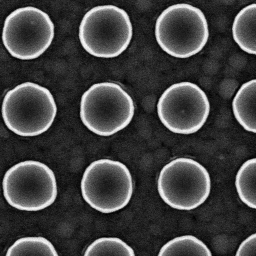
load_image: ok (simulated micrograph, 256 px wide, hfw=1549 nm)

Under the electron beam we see a regular array of raised bodies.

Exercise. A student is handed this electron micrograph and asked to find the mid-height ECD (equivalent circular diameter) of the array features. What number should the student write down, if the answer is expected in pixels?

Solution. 50.3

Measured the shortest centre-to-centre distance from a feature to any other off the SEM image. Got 462 nanometers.